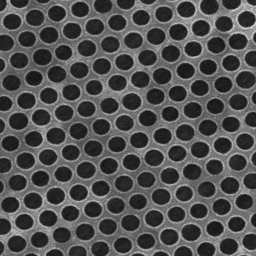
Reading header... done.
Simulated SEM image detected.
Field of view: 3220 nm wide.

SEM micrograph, a regular array of holes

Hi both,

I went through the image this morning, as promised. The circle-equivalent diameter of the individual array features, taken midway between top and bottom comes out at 17.6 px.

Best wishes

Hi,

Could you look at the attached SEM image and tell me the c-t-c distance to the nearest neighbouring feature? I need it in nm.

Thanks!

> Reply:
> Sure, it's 283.